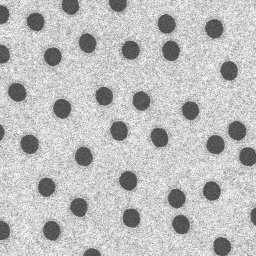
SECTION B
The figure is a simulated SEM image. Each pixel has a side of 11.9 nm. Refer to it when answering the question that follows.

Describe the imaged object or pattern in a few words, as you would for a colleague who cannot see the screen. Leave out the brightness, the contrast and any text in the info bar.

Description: a regular array of holes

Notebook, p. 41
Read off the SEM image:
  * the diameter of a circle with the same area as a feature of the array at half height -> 222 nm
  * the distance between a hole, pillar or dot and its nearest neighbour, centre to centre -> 444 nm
